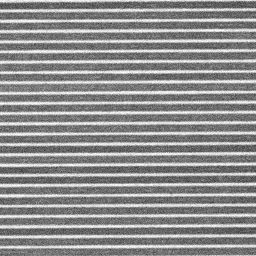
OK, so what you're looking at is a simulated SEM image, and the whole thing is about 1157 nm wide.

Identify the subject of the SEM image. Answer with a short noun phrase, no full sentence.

parallel lines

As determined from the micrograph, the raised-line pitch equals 46.5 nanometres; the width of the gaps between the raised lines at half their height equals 35.6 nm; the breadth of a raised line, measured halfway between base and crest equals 13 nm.